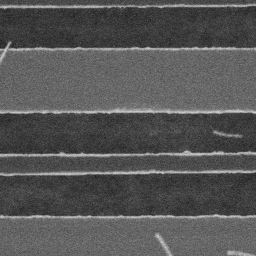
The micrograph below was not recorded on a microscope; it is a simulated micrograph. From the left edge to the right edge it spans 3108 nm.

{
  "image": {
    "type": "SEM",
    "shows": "lines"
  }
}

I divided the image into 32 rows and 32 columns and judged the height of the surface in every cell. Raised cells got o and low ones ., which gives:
oooooooooooooooooooooooooooooooo
................................
................................
................................
................................
................................
oooooooooooooooooooooooooooooooo
oooooooooooooooooooooooooooooooo
oooooooooooooooooooooooooooooooo
oooooooooooooooooooooooooooooooo
oooooooooooooooooooooooooooooooo
oooooooooooooooooooooooooooooooo
oooooooooooooooooooooooooooooooo
oooooooooooooooooooooooooooooooo
................................
................................
................................
................................
................................
oooooooooooooooooooooooooooooooo
oooooooooooooooooooooooooooooooo
oooooooooooooooooooooooooooo.ooo
................................
................................
................................
................................
................................
oooooooooooooooooooooooooooooooo
oooooooooooooooooooooooooooooooo
oooooooooooooooooooooooooooooooo
oooooooooooooooooooooooooooooooo
oooooooooooooooooooooooooooooooo